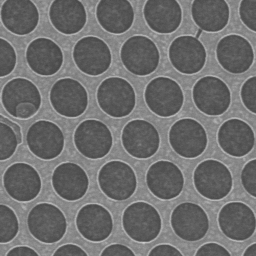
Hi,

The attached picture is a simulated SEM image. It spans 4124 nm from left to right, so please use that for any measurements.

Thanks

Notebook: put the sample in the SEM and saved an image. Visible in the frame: a regular array of holes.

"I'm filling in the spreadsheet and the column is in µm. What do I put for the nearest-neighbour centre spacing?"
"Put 0.767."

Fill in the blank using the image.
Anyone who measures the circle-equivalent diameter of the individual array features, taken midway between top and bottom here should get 624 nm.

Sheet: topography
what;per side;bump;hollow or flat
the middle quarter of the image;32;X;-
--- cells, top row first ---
XXX--------XXXX--------XXXX-----
XXXX-------XXXXX-------XXXXX----
XXXXX----XXXXXXXX----XXXXXXXXXX-
XXXXXXXXXXX---XXXXXXXXX---XXXXXX
----XXXXXX------XXXXX-------XXXX
-----XXXX--------XXXX--------XXX
------XX---------XXX---------XXX
------XX----------XX----------XX
------XX----------XX----------XX
------XX----------XX----------XX
------XXX---------XXX---------XX
-----XXXX--------XXXXX-------XXX
----XXXXXXX-----XXXXXXX-----XXXX
XXXXXXXXXXXXXXXXXXXXXXXXXXXXXX-X
XXXX-----XXXXXXX-----XXXXXXX----
XXX--------XXXX-------XXXXX-----
XXX--------XXXX--------XXXX-----
XXX---------XX----------XX------
XX----------XX----------XX------
XXX---------XX----------XX------
XXX---------XXX---------XXX-----
XXX---------XXX--------XXXXX----
XXXX-------XXXXX-------XXXXX----
XXXXXX---XXXXXXXXX---XXXXXXXXX--
XXXXXXXXXXX----XXXXXXXX---XXXXXX
----XXXXXX------XXXXXX------XXXX
-----XXXX--------XXXX--------XXX
------XXX---------XXX---------XX
------XXX---------XX----------XX
------XXX---------XX----------XX
------XXX---------XXX---------XX
------XXX---------XXX--------XXX